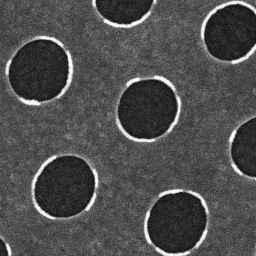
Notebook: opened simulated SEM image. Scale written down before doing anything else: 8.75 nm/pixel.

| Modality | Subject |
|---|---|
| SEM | holes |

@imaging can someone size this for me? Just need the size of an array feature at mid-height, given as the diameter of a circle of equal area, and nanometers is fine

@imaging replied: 536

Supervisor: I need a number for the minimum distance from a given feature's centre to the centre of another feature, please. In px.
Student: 114